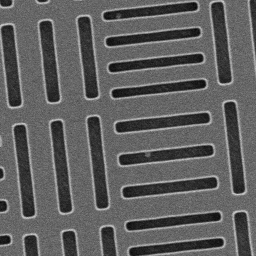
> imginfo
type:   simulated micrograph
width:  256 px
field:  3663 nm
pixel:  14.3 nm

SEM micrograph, groups of lines, slits or small figures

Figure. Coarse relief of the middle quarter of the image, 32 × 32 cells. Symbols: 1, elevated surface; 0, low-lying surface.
11111000111000000000000000001111
11111000111000000001111111111111
11111000111111111111111111111111
11111000111111111111111111111111
11111000111111111111111111111000
11111000111111111111000000000000
11111000011100000000000000000000
11111000011100000000000011111111
11111100111110111111111111111111
11111111111111111111111111111111
11111111111111111111111111111111
11111111111111111111111111111111
11111111111111111111111111111100
11111100011111111111000000000000
11111100011111000000000000000000
11111100011110000000000000000011
11111100011110000000000111111111
11111100011111111111111111111111
11111100001111111111111111111111
11111100001111111111111111111111
11111100001111111111111111111111
01111100001111111111111100000000
01111100001111000000000000000000
01111110001111000000000000000000
01111110001111000000000011111111
01111110001111111111111111111111
01111110001111111111111111111111
01111110001111111111111111111111
01111110000111111111111111111111
01111110000111111111111100000000
01111110000111111000000000000000
00111111000111000000000000000000